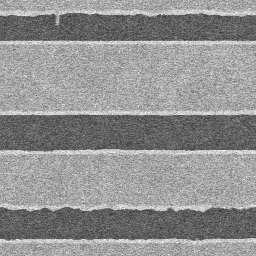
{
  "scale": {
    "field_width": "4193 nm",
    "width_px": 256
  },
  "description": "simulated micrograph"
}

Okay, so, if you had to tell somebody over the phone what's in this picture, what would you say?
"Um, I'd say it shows one or a few lines or trenches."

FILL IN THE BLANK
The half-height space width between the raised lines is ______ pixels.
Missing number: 33.9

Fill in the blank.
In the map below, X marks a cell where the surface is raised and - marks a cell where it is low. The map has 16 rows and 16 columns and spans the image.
XXXXXXXXXXXXXXXX
----------------
----------------
XXXXXXXXXXXXXXXX
XXXXXXXXXXXXXXXX
XXXXXXXXXXXXXXXX
XXXXXXXXXXXXXXXX
----------------
----------------
------X---------
XXXXXXXXXXXXXXXX
XXXXXXXXXXXXXXXX
XXXXXXXXXXXXXXXX
----------------
----------------
XXXXXXXXXXXXXXXX